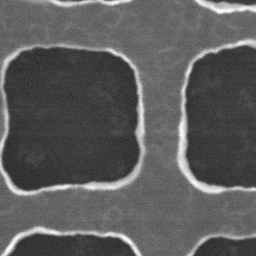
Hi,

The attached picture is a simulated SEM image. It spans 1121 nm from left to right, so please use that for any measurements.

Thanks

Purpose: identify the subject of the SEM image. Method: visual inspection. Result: holes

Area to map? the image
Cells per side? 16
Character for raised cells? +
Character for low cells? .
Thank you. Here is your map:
++++++++++++++++
++++++++++++++++
++++++++++++++++
+......++++++...
........++++....
.........+++....
.........+++....
.........+++....
.........+++....
.........+++....
.........+++....
+......++++++...
++++++++++++++++
++++++++++++++++
++++++++++++++++
+.......++++....